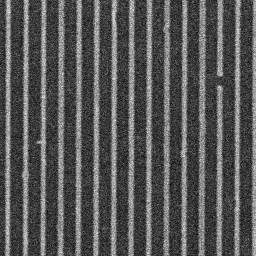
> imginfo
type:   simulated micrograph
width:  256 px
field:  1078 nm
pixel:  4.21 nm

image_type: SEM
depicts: parallel lines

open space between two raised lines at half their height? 58 nm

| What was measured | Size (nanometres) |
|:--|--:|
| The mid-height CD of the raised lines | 14.8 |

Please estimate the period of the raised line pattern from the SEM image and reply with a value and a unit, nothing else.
74.4 nanometers